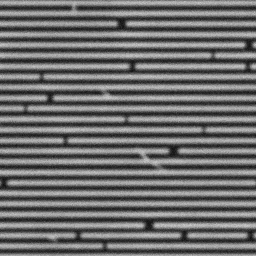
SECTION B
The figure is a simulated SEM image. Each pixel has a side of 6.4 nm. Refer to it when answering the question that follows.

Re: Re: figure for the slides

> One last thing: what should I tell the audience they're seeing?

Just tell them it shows parallel lines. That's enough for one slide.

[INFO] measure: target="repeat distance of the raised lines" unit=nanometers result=67.6